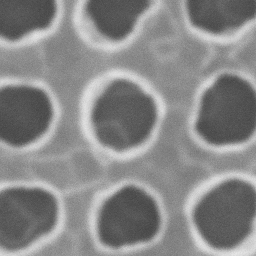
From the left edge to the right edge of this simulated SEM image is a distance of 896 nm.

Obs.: holes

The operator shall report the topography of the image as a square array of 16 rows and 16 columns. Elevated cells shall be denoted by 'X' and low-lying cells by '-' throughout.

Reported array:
----X----XXX----
---XX----XXX---X
XXXXXXX-XXXXXXXX
XXXXXXXXXXXXXXXX
XXXXXXXXXXXXXXXX
--XXXX---XXXX---
---XXX----XX----
---XXX----XX----
---XXX----XXX---
XXXXXXX-XXXXXXXX
XXXXXXXXXXXXXXXX
XXXXXXXXXXXXXX--
----XXX---XX----
----XX----XX----
---XXX----XX----
--XXXXXXXXXXX--X